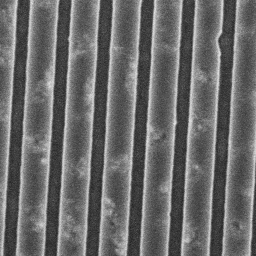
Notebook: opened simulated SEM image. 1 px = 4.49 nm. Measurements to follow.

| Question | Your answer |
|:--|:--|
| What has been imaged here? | parallel lines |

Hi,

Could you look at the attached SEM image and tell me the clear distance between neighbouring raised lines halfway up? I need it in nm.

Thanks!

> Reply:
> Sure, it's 60.5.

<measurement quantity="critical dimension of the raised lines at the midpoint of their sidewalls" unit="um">0.121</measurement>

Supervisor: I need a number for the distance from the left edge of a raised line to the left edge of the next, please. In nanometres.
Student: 185